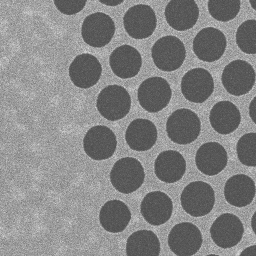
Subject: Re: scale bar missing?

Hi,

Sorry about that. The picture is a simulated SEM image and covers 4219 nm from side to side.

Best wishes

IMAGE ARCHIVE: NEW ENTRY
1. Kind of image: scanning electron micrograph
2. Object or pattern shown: a regular array of holes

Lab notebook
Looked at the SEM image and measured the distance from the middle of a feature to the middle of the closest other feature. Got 694 nm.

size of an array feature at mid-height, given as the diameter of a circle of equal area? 569 nanometers